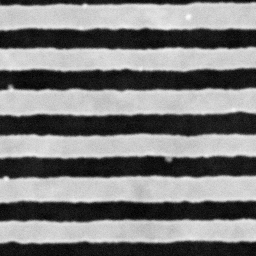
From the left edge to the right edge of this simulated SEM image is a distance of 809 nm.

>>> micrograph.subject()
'lines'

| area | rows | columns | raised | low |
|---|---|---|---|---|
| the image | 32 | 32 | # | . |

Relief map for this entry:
........................########
################################
################################
################################
................................
................................
################################
################################
################################
................................
................................
################################
################################
################################
..#.............................
................................
................................
################################
################################
##################..#######.#..#
................................
................................
################################
################################
################################
................................
................................
..............................##
################################
################################
................................
................................